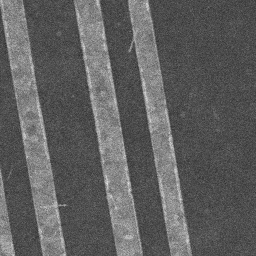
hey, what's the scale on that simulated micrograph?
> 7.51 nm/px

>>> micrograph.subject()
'one or a few lines or trenches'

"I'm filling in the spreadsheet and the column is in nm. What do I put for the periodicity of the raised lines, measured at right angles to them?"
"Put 468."